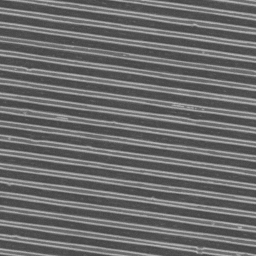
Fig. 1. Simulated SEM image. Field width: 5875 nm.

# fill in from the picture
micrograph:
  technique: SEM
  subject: parallel lines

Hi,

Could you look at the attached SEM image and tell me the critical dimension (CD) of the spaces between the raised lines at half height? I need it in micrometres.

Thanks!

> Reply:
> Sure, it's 0.199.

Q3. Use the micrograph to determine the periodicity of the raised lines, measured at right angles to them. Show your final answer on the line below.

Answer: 322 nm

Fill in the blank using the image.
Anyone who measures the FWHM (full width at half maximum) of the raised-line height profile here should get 131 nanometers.